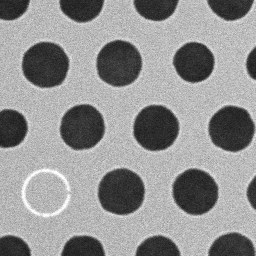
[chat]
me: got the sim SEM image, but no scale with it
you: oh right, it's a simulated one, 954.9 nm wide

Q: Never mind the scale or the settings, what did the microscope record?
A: a regular array of holes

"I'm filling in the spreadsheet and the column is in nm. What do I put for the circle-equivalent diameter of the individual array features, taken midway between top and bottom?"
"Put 172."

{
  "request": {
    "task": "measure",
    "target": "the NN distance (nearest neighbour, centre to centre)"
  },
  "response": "271 nanometres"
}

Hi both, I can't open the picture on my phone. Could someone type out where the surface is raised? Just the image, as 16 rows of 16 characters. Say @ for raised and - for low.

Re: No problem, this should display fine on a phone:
--@@--@@@--@@---
@@@@@@@@@@@@@@@@
@@@@@@@@@@@@@@@@
@@--@@---@@--@@@
@---@@---@@--@@@
@@@@@@@@@@@@@@@@
@@@@@@@@@@@@@@@@
--@@--@@---@@---
--@@--@@---@@---
@@@@@@@@@@@@@@@@
@@@@@@@@@@@@@@@@
@@@@@@---@@--@@@
@@@@@@---@@---@@
@@@@@@@@@@@@@@@@
@@@@@@@@@@@@@@@@
--@@--@@@--@@---